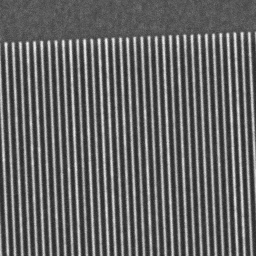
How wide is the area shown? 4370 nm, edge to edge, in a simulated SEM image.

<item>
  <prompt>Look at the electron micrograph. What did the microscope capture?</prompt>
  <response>parallel lines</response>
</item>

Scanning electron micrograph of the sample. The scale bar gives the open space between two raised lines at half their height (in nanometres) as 102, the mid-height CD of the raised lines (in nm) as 27.7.